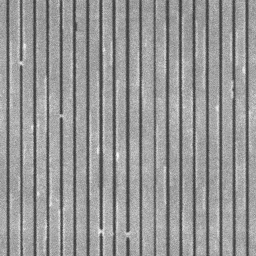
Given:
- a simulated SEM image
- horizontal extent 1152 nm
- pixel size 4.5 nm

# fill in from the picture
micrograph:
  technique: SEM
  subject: parallel lines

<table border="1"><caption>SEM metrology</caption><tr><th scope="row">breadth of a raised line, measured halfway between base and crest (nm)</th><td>43.4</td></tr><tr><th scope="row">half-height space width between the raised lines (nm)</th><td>12.9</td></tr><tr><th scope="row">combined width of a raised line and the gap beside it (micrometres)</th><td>0.0598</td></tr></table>